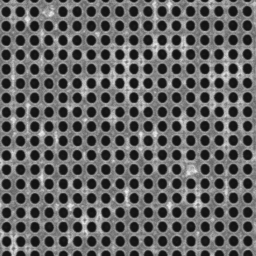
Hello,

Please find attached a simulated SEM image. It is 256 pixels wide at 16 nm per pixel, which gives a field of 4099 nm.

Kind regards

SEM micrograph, a regular array of holes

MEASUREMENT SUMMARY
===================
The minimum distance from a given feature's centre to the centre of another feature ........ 225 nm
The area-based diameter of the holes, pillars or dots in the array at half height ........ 0.165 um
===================